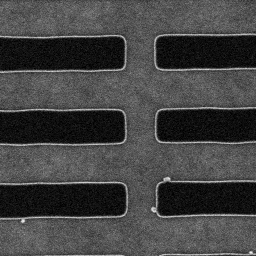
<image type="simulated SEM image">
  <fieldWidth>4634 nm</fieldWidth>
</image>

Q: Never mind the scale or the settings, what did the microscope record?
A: groups of lines, slits or small figures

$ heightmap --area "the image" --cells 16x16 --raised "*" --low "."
................
................
********..******
********..******
*...............
................
................
********..******
********..******
................
................
********..******
********..******
*******...**....
................
................